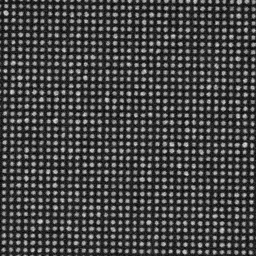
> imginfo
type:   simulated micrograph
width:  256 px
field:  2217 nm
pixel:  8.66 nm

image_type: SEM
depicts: a regular array of raised bodies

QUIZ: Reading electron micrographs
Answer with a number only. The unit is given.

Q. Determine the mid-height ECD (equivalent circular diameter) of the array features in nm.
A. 33.9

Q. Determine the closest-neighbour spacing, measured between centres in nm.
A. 60.1